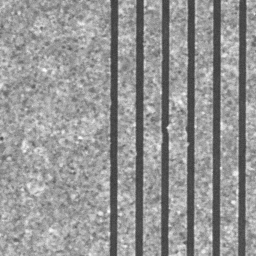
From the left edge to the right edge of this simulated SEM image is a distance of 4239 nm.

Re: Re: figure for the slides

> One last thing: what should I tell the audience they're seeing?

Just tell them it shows parallel lines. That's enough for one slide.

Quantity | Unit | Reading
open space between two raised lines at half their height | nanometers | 139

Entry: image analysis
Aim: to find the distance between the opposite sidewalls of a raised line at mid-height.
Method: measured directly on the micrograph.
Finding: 275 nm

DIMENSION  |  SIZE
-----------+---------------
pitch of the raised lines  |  426 nanometres